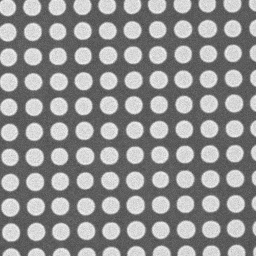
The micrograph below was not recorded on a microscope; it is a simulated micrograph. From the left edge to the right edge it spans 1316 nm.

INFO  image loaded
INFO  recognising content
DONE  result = an array of small figures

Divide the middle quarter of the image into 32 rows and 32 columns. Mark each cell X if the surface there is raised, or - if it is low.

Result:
--------------------------------
--------------------------------
----XX----XX----XXX---XXX---XXXX
X--XXXX--XXXX--XXXX--XXXXX--XXXX
X--XXXX--XXXX--XXXX--XXXXX--XXXX
X--XXXX---XXX---XXX---XXX---XXX-
--------------------------------
--------------------------------
----XX----XX----XXX----XX----XX-
X--XXXX--XXXX--XXXXX--XXXX--XXXX
X--XXXX--XXXX--XXXXX--XXXX--XXXX
X--XXXX--XXXX---XXX---XXXX---XX-
----XX----XX--------------------
--------------------------------
-----------------X-----XX----XX-
X--XXXX---XXX---XXXX--XXXX--XXXX
X--XXXX--XXXX---XXXX--XXXX--XXXX
X--XXXX--XXXX---XXXX--XXXX--XXXX
----XXX----X-----X-----XX-------
--------------------------------
--------------------------------
----XXX---XXX---XXX---XXXX--XXXX
X--XXXX--XXXXX--XXXX--XXXX--XXXX
X--XXXX--XXXXX--XXXX--XXXX--XXXX
----XXX---XXX---XXX----XX----XX-
--------------------------------
--------------------------------
----XXX---XXX---XXX----XXX---XXX
X--XXXX--XXXXX--XXXX--XXXX--XXXX
X--XXXX--XXXXX--XXXX--XXXX--XXXX
X---XXX---XXX---XXX----XX----XXX
--------------------------------